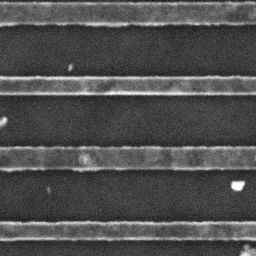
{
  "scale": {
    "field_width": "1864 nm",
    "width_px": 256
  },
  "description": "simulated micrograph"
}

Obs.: lines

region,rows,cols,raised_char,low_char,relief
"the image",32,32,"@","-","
@@@@@@@@@@@@@@@@@@@@@@@@@@@@@@@@
@@@@@@@@@@@@@@@@@@@@@@@@@@@@@@@@
@@@@@@@@@@@@@@@@@@@@@@@@@@@@@@@@
--------------------------------
--------------------------------
--------------------------------
--------------------------------
--------------------------------
--------------------------------
--------------------------------
@@@@@@@@@@@@@@@@@@@@@@@@@@@@@@@@
@@@@@@@@@@@@@@@@@@@@@@@@@@@@@@@@
--------------------------------
--------------------------------
--------------------------------
--------------------------------
--------------------------------
--------------------------------
--@@@@@@@-@@@--@@@@@---@@@@@@@@@
@@@@@@@@@@@@@@@@@@@@@@@@@@@@@@@@
@@@@@@@@@@@@@@@@@@@@@@@@@@@@@@@@
--------------------------------
--------------------------------
-----------------------------@--
--------------------------------
--------------------------------
--------------------------------
--------------------------------
@@@@@@@@@@@@@@@@@@@@@@@@@@@@@@@@
@@@@@@@@@@@@@@@@@@@@@@@@@@@@@@@@
--------------------------------
--------------------------------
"